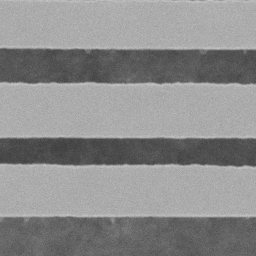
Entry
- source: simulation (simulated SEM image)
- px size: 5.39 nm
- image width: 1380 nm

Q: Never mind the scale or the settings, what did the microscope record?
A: lines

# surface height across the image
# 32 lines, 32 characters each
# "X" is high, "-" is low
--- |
XXXXXXXXXXXXXXXXXXXXXXXXXXXXXXXX
XXXXXXXXXXXXXXXXXXXXXXXXXXXXXXXX
XXXXXXXXXXXXXXXXXXXXXXXXXXXXXXXX
XXXXXXXXXXXXXXXXXXXXXXXXXXXXXXXX
XXXXXXXXXXXXXXXXXXXXXXXXXXXXXXXX
XXXXXXXXXXXXXXXXXXXXXXXXXXXXXXXX
--------------------------------
--------------------------------
--------------------------------
--------------------------------
XXXXXXXXXXXXXXXXXXXXXXXXXXX-XX--
XXXXXXXXXXXXXXXXXXXXXXXXXXXXXXXX
XXXXXXXXXXXXXXXXXXXXXXXXXXXXXXXX
XXXXXXXXXXXXXXXXXXXXXXXXXXXXXXXX
XXXXXXXXXXXXXXXXXXXXXXXXXXXXXXXX
XXXXXXXXXXXXXXXXXXXXXXXXXXXXXXXX
XXXXXXXXXXXXXXXXXXXXXXXXXXXXXXXX
--------------------------------
--------------------------------
--------------------------------
--------------------------------
XXXXXXXXXXXXXXXXXXXXXXXXXXXXXXXX
XXXXXXXXXXXXXXXXXXXXXXXXXXXXXXXX
XXXXXXXXXXXXXXXXXXXXXXXXXXXXXXXX
XXXXXXXXXXXXXXXXXXXXXXXXXXXXXXXX
XXXXXXXXXXXXXXXXXXXXXXXXXXXXXXXX
XXXXXXXXXXXXXXXXXXXXXXXXXXXXXXXX
--------------------------------
--------------------------------
--------------------------------
--------------------------------
--------------------------------